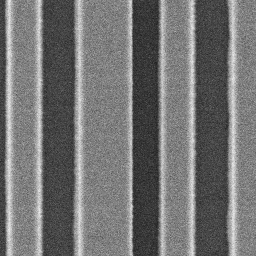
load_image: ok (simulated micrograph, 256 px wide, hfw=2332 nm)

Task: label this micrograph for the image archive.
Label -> lines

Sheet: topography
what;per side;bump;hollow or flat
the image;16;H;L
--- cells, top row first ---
HHHLLHHHLLHHLLHH
LHHLLHHHLLHHLLHH
LHHLLHHHLLHHLLHH
LHHLLHHHLLHHLLHH
LHHLLHHHLLHHLLHH
LHHLLHHHLLHHLLHH
LHHLLHHHLLHHLLHH
LHHLLHHHLLHHLLHH
LHHLLHHHLLHHLLHH
LHHLLHHHLLHHLLHH
HHHLLHHHLLHHLLHH
LHHLLHHHLLHHLLHH
LHHLLHHHLLHHLLLH
HHHLLHHHLLHHLLHH
LHHLLHHHLLHHLLHH
LHHLLHHHLLHHLLLH